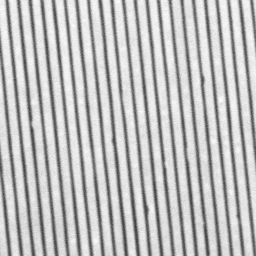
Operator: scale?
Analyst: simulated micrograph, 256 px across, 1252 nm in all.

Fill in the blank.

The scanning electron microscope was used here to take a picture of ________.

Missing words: parallel lines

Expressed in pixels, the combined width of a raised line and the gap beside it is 11.6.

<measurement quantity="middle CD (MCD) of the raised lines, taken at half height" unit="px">7.59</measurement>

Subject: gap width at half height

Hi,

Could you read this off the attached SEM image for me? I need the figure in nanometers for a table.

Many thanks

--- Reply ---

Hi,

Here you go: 18.8